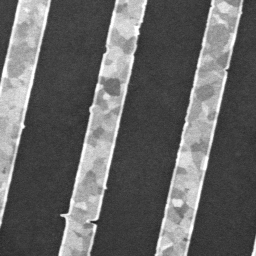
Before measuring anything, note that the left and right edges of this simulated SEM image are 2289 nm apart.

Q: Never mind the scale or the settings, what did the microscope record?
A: one or a few lines or trenches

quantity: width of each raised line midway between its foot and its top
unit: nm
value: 256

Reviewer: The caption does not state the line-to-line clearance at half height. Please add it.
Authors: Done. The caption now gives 65.9 px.